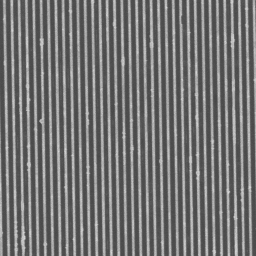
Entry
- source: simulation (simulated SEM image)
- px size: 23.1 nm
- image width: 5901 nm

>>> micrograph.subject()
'parallel lines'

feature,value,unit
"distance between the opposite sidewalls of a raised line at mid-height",63.4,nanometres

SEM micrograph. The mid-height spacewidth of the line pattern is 110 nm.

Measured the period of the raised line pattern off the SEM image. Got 0.169 micrometres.